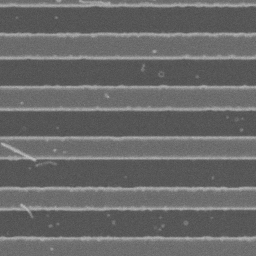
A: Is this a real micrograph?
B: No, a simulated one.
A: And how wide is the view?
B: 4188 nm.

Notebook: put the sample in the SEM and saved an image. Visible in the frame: lines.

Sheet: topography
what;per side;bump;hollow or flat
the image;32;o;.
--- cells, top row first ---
oooooooooooooooooooooooooooooooo
................................
................................
................................
oooooooooooooooooooooooooooooooo
oooooooooooooooooooooooooooooooo
oooooooooooooooooooooooooooooooo
................................
................................
................................
................................
oooooooooooooooooooooooooooooooo
oooooooooooooooooooooooooooooooo
oooooooooooooooooooooooooooooooo
................................
................................
................................
oooooooooooooooooooooooooooooooo
oooooooooooooooooooooooooooooooo
oooooooooooooooooooooooooooooooo
................................
................................
................................
ooooooooo.ooo....oooooooooooo.oo
oooooooooooooooooooooooooooooooo
oooooooooooooooooooooooooooooooo
................................
................................
................................
................................
oooooooooooooooooooooooooooooooo
oooooooooooooooooooooooooooooooo